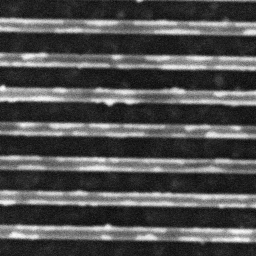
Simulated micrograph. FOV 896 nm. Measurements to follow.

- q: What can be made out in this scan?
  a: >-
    parallel lines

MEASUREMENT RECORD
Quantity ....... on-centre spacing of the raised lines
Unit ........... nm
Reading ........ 121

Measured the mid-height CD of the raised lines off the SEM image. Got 43.8 nanometres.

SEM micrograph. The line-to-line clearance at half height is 77.5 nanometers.